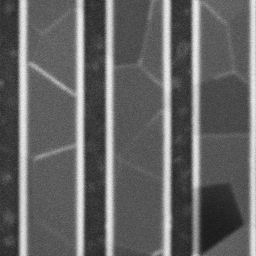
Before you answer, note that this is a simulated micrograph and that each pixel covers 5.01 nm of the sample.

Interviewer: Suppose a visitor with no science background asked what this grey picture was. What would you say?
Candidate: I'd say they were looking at one or a few lines or trenches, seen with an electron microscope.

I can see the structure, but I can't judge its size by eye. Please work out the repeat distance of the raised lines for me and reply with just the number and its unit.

0.433 um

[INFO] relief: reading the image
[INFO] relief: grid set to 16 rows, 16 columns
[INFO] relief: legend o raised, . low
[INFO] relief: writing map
.oooo..ooo..oooo
.oooo..ooo..oooo
.oooo..ooo..oooo
.oooo..ooo..oooo
.oooo..ooo..oooo
.oooo..ooo..oooo
.oooo..ooo..oooo
.oooo..ooo..oooo
.oooo..ooo..oooo
.oooo..ooo..oooo
.oooo..ooo..oooo
.oooo..ooo..oooo
.oooo..ooo..oooo
.oooo..ooo..oooo
.oooo..ooo..oooo
.oooo..ooo..oooo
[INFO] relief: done